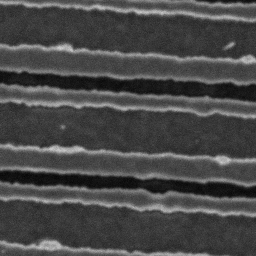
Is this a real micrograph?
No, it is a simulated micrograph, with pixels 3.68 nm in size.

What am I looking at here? lines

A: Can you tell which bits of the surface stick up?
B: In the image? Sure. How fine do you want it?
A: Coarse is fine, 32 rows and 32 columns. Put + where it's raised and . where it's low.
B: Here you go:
...+++++++++++++++++++++++++++++
.................+++++++++++++++
..............................++
................................
................................
................................
+++++++++++++++.................
++++++++++++++++++++++++++++++++
++++++++++++++++++++++++++++++++
...........+.+++++++++++++++++++
.............................++.
++++++++++++++..................
+++++++++++++++++++++++++++++...
..............++++++++++++++++++
..............................++
................................
................................
................................
+++++.++++......................
+++++++++++++++++++++++.........
++++++++++++++++++++++++++++++++
......++++++++++++++++++++++++++
.......................+++++++++
++++++++++......................
+++++++++++++++++++++++++.......
............++++++++++++++++++++
..........................++++++
................................
................................
................................
++...++.........................
++++++++++++++++................